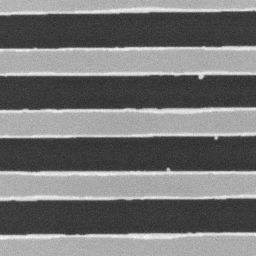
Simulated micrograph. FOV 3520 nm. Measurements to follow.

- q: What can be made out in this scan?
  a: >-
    lines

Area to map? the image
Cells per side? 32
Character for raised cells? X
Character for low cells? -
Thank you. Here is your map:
XXXXXXXXXXXXXXXXXXXXXXXXXXXXXXXX
XXXXXXXXXXXXXX------------------
--------------------------------
--------------------------------
--------------------------------
--------------------------------
XXXXXXXXXXXXXXXXXXXXXXXXXXXXXXXX
XXXXXXXXXXXXXXXXXXXXXXXXXXXXXXXX
XXXXXXXXXXXXXXXXXXXXXXXXXXXXXXXX
--------------------------------
--------------------------------
--------------------------------
--------------------------------
--------------------------------
XXXXXXXXXXXXXXXXXXXXXXXXXXXXXXXX
XXXXXXXXXXXXXXXXXXXXXXXXXXXXXXXX
XXXXXXXXXXXXXXXXXXXXXXXXXXXXXXXX
--------------------------------
--------------------------------
--------------------------------
--------------------------------
--------------------------XXXX--
XXXXXXXXXXXXXXXXXXXXXXXXXXXXXXXX
XXXXXXXXXXXXXXXXXXXXXXXXXXXXXXXX
XXXXXXXXXXXXXXXXXXXXXXXXXXXXXXXX
--------------------------------
--------------------------------
--------------------------------
--------------------------------
------XXXXXXXXXXXXXXXXXXXXXXXXXX
XXXXXXXXXXXXXXXXXXXXXXXXXXXXXXXX
XXXXXXXXXXXXXXXXXXXXXXXXXXXXXXXX